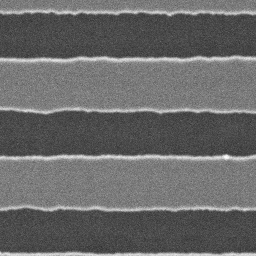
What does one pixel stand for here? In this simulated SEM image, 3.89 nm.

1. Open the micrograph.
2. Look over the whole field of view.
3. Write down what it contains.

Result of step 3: lines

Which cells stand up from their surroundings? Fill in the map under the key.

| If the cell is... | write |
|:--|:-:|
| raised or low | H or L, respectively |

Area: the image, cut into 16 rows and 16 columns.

HHHHHHHHHHHHHHHH
LLLLLLLLLLLLLLLL
LLLLLLLLLLLLLLLL
LLLLLLLLLLLLLLLL
HHHHHHHHHHHHHHHH
HHHHHHHHHHHHHHHH
HHHHHHHHHHHHHHHH
LLLLLLLLLLLLLLLL
LLLLLLLLLLLLLLLL
LLLLLLLLLLLLLLLL
HHHHHHHHHHHHHHHH
HHHHHHHHHHHHHHHH
HHHHHHHHHHHHHHHH
LLLLLLLLLLLLLLLL
LLLLLLLLLLLLLLLL
LLLLLLLLLLLLLLLL